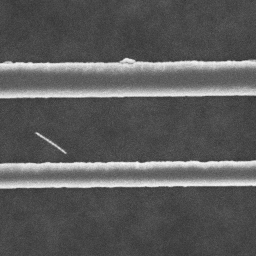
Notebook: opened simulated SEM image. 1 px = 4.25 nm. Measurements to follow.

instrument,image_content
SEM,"lines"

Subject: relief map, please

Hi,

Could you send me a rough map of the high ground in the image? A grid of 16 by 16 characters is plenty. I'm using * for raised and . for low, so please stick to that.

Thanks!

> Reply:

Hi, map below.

................
................
................
................
****************
****************
................
................
................
................
****************
***************.
................
................
................
................